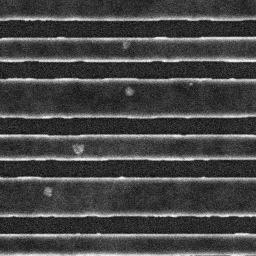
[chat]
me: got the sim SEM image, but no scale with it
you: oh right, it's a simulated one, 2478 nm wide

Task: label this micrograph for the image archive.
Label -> lines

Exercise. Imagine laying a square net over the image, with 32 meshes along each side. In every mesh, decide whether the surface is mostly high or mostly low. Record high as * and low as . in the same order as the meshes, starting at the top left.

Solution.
********************************
********************************
................................
................................
................................
********************************
********************************
********************************
................................
................................
********************************
********************************
********************************
********************************
*******************************.
................................
................................
********************************
********************************
********************************
................................
................................
********************************
********************************
********************************
********************************
********************************
................................
................................
********************************
********************************
********************************